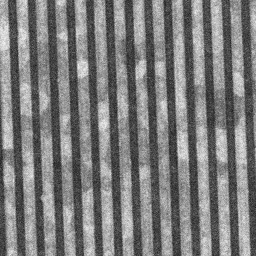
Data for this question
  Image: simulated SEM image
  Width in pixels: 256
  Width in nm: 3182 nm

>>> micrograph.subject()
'parallel lines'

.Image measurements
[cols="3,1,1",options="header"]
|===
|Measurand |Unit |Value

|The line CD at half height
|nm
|120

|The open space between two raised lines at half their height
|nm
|118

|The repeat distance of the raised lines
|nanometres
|241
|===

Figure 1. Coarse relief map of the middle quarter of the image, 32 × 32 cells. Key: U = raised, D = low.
UDDDUUDDUUUDDUUUDDUUDDDUUDDDUUDD
UDDDUUDDUUUDDUUUDDUUDDDUUDDDUUDD
UDDDUUDDUUUDDUUUDDUUDDDUUDDDUUDD
UDDDUUDDUUUDDUUUDDUUDDDUUDDDUUDD
UDDDUUDDDUUDDUUUDDUUDDDUUDDDUUDD
UDDDUUDDUUUDDUUUDDUUDDDUUDDDUUDD
UDDDUUDDDUUDDDUUDDUUUDDUUUDDUUDD
UDDDUUDDDUUDDUUUDDUUUDDUUUDDUUDD
UDDDUUDDDUUDDUUUDDUUUDDUUUDDUUDD
UDDDUUDDDUUDDDUUDDUUUDDUUUDDUUDD
UDDDUUDDDUUDDDUUDDUUUDDUUUDDUUDD
UDDDUUDDDUUDDDUUDDDUUDDUUUDDUUDD
UDDDUUDDDUUDDDUUDDDUUDDUUUDDUUUD
UDDDUUDDDUUDDDUUDDDUUDDUUUDDUUUD
UDDDUUDDDUUDDDUUDDDUUDDUUUDDUUUD
UUDDUUDDDUUDDDUUDDDUUDDUUUDDUUUD
UUDDUUDDDUUDDDUUDDDUUDDUUUDDUUUD
UUDDUUDDDUUDDDUUDDDUUDDDUUDDDUUD
UUDDUUDDDUUDDDUUDDDUUDDDUUDDDUUD
UUDDUUDDDUUDDDUUDDDUUDDDUUDDDUUD
UUDDUUDDDUUDDDUUDDDUUDDDUUDDDUUD
UUDDUUUDDUUDDDUUDDDUUDDDUUDDUUUD
UUDDUUUDDUUDDDUUDDDUUDDDUUDDUUUD
UUDDUUUDDUUDDDUUUDDUUDDDUUDDDUUD
UUDDUUUDDUUDDDUUUDDUUDDDUUDDDUUD
UUDDUUUDDUUDDDUUUDDUUDDDUUDDDUUD
UUDDUUUDDUUDDDUUUDDUUDDDUUDDDUUD
UUDDUUUDDUUUDDUUUDDUUDDDUUDDDUUD
UUDDDUUDDUUUDDUUUDDUUDDDUUDDDUUD
UUDDDUUDDUUUDDUUUDDUUDDDUUDDDUUD
UUDDDUUDDUUUDDUUUDDUUDDDUUDDDUUD
UUDDDUUDDDUUDDDUUDDUUDDDUUDDDUUD